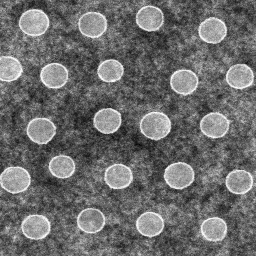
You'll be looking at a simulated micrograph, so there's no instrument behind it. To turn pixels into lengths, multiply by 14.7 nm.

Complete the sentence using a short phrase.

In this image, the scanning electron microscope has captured a regular array of raised bodies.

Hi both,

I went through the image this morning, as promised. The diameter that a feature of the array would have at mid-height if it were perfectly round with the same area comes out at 380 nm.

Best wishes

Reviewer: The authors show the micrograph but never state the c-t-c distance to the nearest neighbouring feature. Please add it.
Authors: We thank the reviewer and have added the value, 53.2 px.